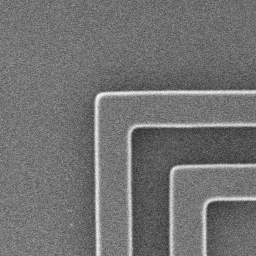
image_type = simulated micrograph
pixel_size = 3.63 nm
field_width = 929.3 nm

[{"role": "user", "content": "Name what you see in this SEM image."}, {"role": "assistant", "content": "groups of lines, slits or small figures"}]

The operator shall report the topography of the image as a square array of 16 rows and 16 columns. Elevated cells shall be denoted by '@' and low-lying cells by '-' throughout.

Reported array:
----------------
----------------
----------------
----------------
----------------
----------------
------@@@@@@@@@@
------@@@@@@@@@@
------@@--------
------@@--------
------@@---@@@@@
------@@---@@@@@
------@@---@@@--
------@@---@@---
------@@---@@---
------@@---@@---